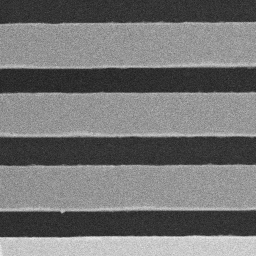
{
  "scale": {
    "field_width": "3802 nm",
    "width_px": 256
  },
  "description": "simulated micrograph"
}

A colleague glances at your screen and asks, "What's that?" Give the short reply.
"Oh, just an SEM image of lines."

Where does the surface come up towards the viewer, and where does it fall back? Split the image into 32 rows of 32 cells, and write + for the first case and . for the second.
................................
................................
................................
++++++++++++++++++++++++++++++++
++++++++++++++++++++++++++++++++
++++++++++++++++++++++++++++++++
++++++++++++++++++++++++++++++++
++++++++++++++++++++++++++++++++
++++++++++++++.+................
................................
................................
................................
++++++++++++++++++++++++++++++++
++++++++++++++++++++++++++++++++
++++++++++++++++++++++++++++++++
++++++++++++++++++++++++++++++++
++++++++++++++++++++++++++++++++
................................
................................
................................
................................
++++++++++++++++++++++++++++++++
++++++++++++++++++++++++++++++++
++++++++++++++++++++++++++++++++
++++++++++++++++++++++++++++++++
++++++++++++++++++++++++++++++++
.......+........................
................................
................................
................................
++++++++++++++++++++++++++++++++
++++++++++++++++++++++++++++++++